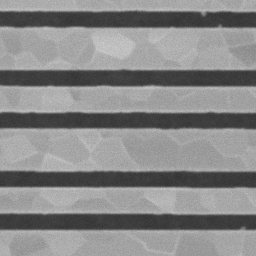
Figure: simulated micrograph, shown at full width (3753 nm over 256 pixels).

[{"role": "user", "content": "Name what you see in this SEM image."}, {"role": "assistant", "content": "lines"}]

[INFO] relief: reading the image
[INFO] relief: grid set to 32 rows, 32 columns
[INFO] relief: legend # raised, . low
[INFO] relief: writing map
################################
................................
................................
##.####.###..........#..........
################################
################################
################################
################################
################################
................................
................................
################################
################################
################################
................................
................................
################################
################################
################################
################################
################################
................................
................................
#######################......##.
################################
################################
################################
................................
................................
################################
################################
################################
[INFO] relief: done